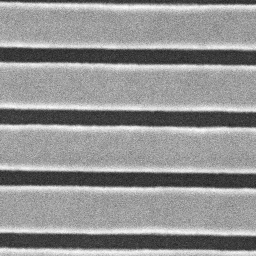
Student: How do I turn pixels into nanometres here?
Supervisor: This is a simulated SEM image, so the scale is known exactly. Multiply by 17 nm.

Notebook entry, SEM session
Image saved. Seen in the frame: lines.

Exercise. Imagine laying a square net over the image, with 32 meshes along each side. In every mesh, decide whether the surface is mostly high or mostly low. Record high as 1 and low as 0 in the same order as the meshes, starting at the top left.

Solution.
11111100000000000000000000000000
11111111111111111111111111111111
11111111111111111111111111111111
11111111111111111111111111111111
11111111111111111111111111111111
11111111111111111111111111111111
00000000000000000000000000000000
00000000000000000000000000000000
11111111111111111111111111111111
11111111111111111111111111111111
11111111111111111111111111111111
11111111111111111111111111111111
11111111111111111111111111111111
00111111111111111111111111111111
00000000000000000000000000000000
00000000000000000000000000000000
11111111111111111111111111111111
11111111111111111111111111111111
11111111111111111111111111111111
11111111111111111111111111111111
11111111111111111111111111111111
00000000000000000000001011111111
00000000000000000000000000000000
11111111111111111111111110000000
11111111111111111111111111111111
11111111111111111111111111111111
11111111111111111111111111111111
11111111111111111111111111111111
11111111111111111111111111111111
00000000000000000000000000000000
00000000000000000000000000000000
11111111111111111111111111111111